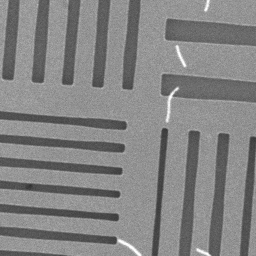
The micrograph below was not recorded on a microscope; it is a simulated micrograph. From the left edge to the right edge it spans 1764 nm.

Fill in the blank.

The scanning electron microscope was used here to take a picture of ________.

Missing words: groups of lines, slits or small figures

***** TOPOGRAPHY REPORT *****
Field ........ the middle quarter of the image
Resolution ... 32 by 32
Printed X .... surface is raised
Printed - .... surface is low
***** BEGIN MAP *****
---XXXX---XXXXX---XXXXXXXXXXXXXX
---XXXX---XXXX----XXXXXXXXXXXXXX
---XXXX---XXXX----XXXXXXX---XXXX
--XXXXX---XXXX----XXXXXX--------
--XXXXX---XXXX----XXXXXX--------
XXXXXXX---XXXX---XXXXXXX--------
XXXXXXXXXXXXXXX--XXXXXXX--------
XXXXXXXXXXXXXXXXXXXXXXXX--------
XXXXXXXXXXXXXXXXXXXXXXXXXXXXX---
XXXXXXXXXXXXXXXXXXXXXXXXXXXXXXXX
XXXXXXXXXXXXXXXXXXXXXXXXXXXXXXXX
XXXXXXXXXXXXXXXXXXXXXXXXXXXXXXXX
XXXXXXXXXXXXXXXXXXXXXXXXXXXXXXXX
----------XXXXXXXXXXXXXXXXXXXXXX
----------------XXXXXXXXXXXXXXXX
XX--------------XXXXXXXXXXXXXXXX
XXXXXXXXXXXXX--XXXXXXXXX--XXXXXX
XXXXXXXXXXXXXXXXXXXXXXXX--XXXXX-
XXXXXXXXXXXXXXXXXXXXXXXX--XXXXX-
-----------XXXXXXXXXXXXX--XXXXX-
---------------XXXXXXXXX--XXXXX-
XXXX-----------XXXXXXXXX--XXXXX-
XXXXXXXXXXXXXXXXXXXXXXXX--XXXXX-
XXXXXXXXXXXXXXXXXXXXXXXX--XXXXX-
XXXXXXXXXXXXXXXXXXXXXXXX-XXXXX--
----------XXXXXXXXXXXXXX-XXXXX--
---------------XXXXXXXX--XXXXX--
XXXXXXX--------XXXXXXXX--XXXXX--
XXXXXXXXXXXXXXXXXXXXXXX--XXXXX--
XXXXXXXXXXXXXXXXXXXXXXX--XXXXX--
---XXXXXXXXXXXXXXXXXXXX--XXXXX--
------------XXXXXXXXXXX--XXXXX--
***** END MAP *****